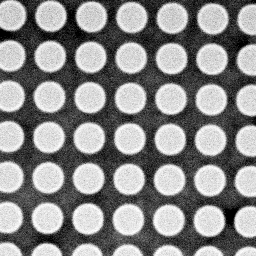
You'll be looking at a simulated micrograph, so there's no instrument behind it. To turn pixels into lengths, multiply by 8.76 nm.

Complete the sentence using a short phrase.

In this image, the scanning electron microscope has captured an array of small figures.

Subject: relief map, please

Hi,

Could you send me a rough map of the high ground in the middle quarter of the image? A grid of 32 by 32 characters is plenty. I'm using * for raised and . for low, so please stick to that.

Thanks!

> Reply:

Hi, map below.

....******....******....******..
.....***.......****......****...
................................
................................
................................
....*****......****......***....
...*******....******....******..
...*******...*******...*******..
...*******...*******...*******..
...*******...*******...*******..
...*******...*******...*******..
.....****.....*****.....*****...
................................
................................
................................
....****.......***.......***....
...******.....*****.....*****...
...*******...*******...*******..
...*******...*******...*******..
...*******...*******...*******..
...******....*******...*******..
....****......*****.....*****...
................................
................................
................................
.....***.......***.......**.....
...******....******.....*****...
...*******...*******...*******..
...*******...*******...*******..
...*******...*******...*******..
...******....*******...*******..
....****......*****.....*****...